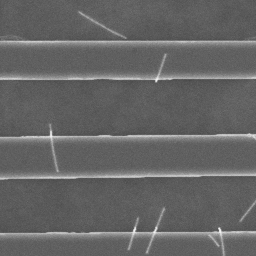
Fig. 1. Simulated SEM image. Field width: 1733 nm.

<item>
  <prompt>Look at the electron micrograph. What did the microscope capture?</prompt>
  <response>lines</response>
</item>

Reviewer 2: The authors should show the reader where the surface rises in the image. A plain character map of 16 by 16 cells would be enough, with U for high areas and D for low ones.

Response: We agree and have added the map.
DDDDDDDDDDDDDDDD
DDDDDDDDDDDDDDDD
DDDDDDDDDDDDDDDD
UUUUUUUUUUUUUUUU
UUUUUUUUUUUUUUUU
DDDDDDDDDDDDDDDD
DDDDDDDDDDDDDDDD
DDDDDDDDDDDDDDDD
DDDUDDUDUUUUUUUU
UUUUUUUUUUUUUUUU
UUUUUUUUUUUUUUUU
DDDDDDDDDDDDDDDD
DDDDDDDDDDDDDDDD
DDDDDDDDDDDDDDDD
DDDDDDDDUUDDDUUU
UUUUUUUUUUUUUUUU